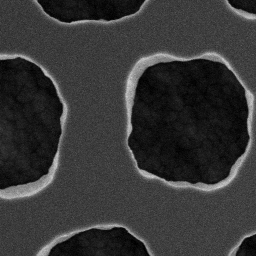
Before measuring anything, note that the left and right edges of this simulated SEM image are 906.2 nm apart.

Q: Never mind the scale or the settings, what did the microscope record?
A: holes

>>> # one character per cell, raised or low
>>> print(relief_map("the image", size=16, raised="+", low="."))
+++......++++++.
++++++++++++++++
++++++++++++++++
++++++++++++++++
...++++++.....++
...+++++.......+
....++++.......+
....++++.......+
....++++........
....++++.......+
...++++++......+
...++++++++...++
++++++++++++++++
++++++++++++++++
+++++...++++++++
+++......++++++.